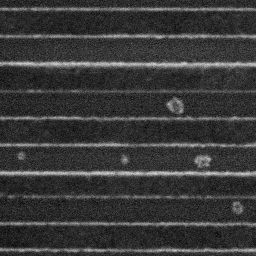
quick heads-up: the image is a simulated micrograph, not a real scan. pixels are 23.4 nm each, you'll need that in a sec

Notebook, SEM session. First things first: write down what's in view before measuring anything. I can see lines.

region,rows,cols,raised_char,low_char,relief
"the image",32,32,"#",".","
................................
################################
################################
################################
################################
................................
................................
................................
################################
################################
################################
................................
................................
................................
................................
################################
################################
################################
................................
................................
................................
................................
################################
################################
################################
................................
................................
................................
################################
################################
################################
................................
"